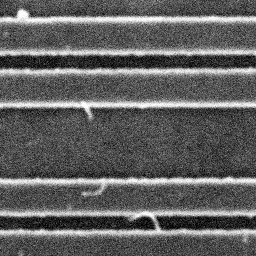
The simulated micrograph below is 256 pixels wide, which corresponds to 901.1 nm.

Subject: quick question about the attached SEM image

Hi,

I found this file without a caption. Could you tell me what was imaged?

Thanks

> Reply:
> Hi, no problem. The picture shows lines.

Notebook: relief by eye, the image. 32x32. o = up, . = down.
................................
................................
oooooooooooooooooooooooooooooooo
oooooooooooooooooooooooooooooooo
oooooooooooooooooooooooooooooooo
oooooooooooooooooooooooooooooooo
oooooooooooooooooooooooooooooooo
................................
................................
oooooooooooooooooooooooooooooooo
oooooooooooooooooooooooooooooooo
oooooooooooooooooooooooooooooooo
oooooooooooooooooooooooooooooooo
................................
................................
................................
................................
................................
................................
................................
................................
................................
....o....oo.oo..oooooooooooooooo
oooooooooooooooooooooooooooooooo
oooooooooooooooooooooooooooooooo
oooooooooooooooooooooooooooooooo
oooooooooooooooooooooooooooooooo
................................
................................
oooooooooooooooooooooooooooooooo
oooooooooooooooooooooooooooooooo
oooooooooooooooooooooooooooooooo